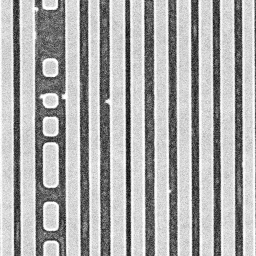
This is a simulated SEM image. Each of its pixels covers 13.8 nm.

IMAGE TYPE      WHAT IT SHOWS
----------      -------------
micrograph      parallel lines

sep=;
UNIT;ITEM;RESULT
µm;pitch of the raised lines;0.304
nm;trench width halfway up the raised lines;129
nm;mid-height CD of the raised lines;181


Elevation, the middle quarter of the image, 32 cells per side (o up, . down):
.ooo..ooo...ooo..ooo...ooo..ooo.
.ooo..ooo...ooo..ooo...ooo..ooo.
.ooo..oo....ooo..ooo...ooo..ooo.
.ooo..ooo...ooo..ooo...ooo..ooo.
.ooo..ooo...ooo..ooo...ooo..ooo.
.ooo..ooo...ooo..ooo...ooo..ooo.
.ooo..ooo...ooo..ooo...ooo..ooo.
.ooo..ooo...ooo..ooo...ooo..ooo.
.ooo..ooo...ooo..ooo...ooo..ooo.
.ooo..ooo...ooo..ooo...ooo..oooo
.ooo..ooo...ooo..ooo...ooo..oooo
.ooo..ooo...ooo..ooo...ooo..oooo
.ooo..ooo...ooo..ooo...ooo..oooo
.ooo..ooo...ooo..ooo...ooo..oooo
.ooo..ooo...ooo..ooo...ooo..oooo
.ooo..ooo...ooo..ooo...ooo..oooo
.ooo..ooo...ooo..ooo...ooo..oooo
.ooo..ooo...ooo..ooo...ooo...ooo
.ooo..ooo...ooo..ooo...ooo...ooo
.ooo..ooo...ooo..ooo...ooo...ooo
.ooo..ooo...ooo..ooo...ooo...ooo
.ooo..ooo...ooo..ooo...ooo...ooo
.ooo..ooo...ooo..ooo...ooo...ooo
.ooo..ooo...ooo..ooo...ooo...ooo
.ooo..ooo...ooo..ooo...ooo...ooo
.ooo..ooo...ooo..ooo...ooo...ooo
.ooo...oo...ooo..ooo...ooo...ooo
.ooo...oo...ooo..ooo...ooo...ooo
.ooo...oo...ooo..ooo...ooo...ooo
.ooo...oo...ooo..ooo...ooo...ooo
.ooo...oo...ooo..ooo...ooo...ooo
.ooo...oo...ooo..ooo...ooo...ooo